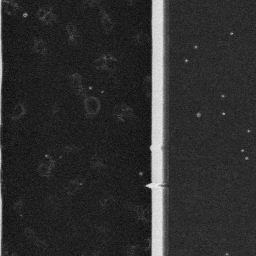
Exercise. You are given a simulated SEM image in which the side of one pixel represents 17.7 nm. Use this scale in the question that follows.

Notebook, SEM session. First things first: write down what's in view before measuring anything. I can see one or a few lines or trenches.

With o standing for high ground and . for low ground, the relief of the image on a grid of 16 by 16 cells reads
..........oooooo
..........oooooo
..........oooooo
..........oooooo
..........oooooo
..........oooooo
..........oooooo
..........oooooo
..........oooooo
..........oooooo
..........oooooo
..........oooooo
..........oooooo
..........oooooo
..........oooooo
..........oooooo